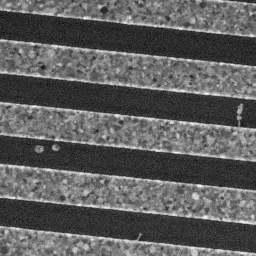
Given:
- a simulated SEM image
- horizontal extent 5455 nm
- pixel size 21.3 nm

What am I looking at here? lines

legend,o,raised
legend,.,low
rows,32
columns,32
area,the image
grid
oooooooooooooooooooooooooooooooo
...ooooooooooooooooooooooooooooo
............oooooooooooooooooooo
......................oooooooooo
...............................o
ooooo...........................
oooooooooooooo..................
oooooooooooooooooooooooo........
oooooooooooooooooooooooooooooooo
....oooooooooooooooooooooooooooo
..............oooooooooooooooooo
.......................ooooooooo
................................
ooooooo.........................
oooooooooooooooo................
ooooooooooooooooooooooooo.......
oooooooooooooooooooooooooooooooo
.......ooooooooooooooooooooooooo
.................ooooooooooooooo
..........................oooooo
................................
ooooooooo.......................
ooooooooooooooooooo.............
oooooooooooooooooooooooooooo....
oooooooooooooooooooooooooooooooo
........oooooooooooooooooooooooo
..................oooooooooooooo
...........................ooooo
oo..............................
ooooooooooo.....................
oooooooooooooooooooo............
oooooooooooooooooooooooooooooo..